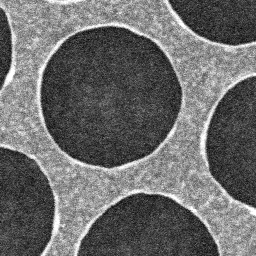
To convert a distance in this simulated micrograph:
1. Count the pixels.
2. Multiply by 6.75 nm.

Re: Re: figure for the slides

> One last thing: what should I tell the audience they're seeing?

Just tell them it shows holes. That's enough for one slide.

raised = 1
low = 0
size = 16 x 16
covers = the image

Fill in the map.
1111111111100000
0111111111100000
0111000001111000
0110000000111111
0110000000011111
1110000000011100
1110000000011100
1110000000011000
1110000000111000
0111000000111000
0001111111111000
0001111111111100
0001111000011110
0001110000001111
0001100000000111
0001100000000011